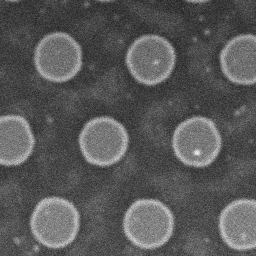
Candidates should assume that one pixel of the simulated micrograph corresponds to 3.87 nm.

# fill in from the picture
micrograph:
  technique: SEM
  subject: raised bodies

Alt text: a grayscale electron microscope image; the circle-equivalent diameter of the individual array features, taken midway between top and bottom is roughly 184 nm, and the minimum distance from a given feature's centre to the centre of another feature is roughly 360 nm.